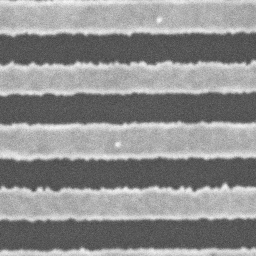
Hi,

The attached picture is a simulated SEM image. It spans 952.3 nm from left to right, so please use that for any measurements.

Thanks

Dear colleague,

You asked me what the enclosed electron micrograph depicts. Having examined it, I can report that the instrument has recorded lines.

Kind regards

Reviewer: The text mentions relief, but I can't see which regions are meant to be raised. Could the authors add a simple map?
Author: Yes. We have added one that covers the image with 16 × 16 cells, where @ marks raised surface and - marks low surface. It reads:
@@@@@@@@@@@@@@@@
@@@@@@@@@@@@@@@@
----------------
----------------
@@@@@@@@@@@@@@@@
@@@@@@@@@@@@@@@@
----------------
----------------
@@@@@@@@@@@@@@@@
@@@@@@@@@@@@@@@@
----------------
----------------
@@@@@@@@@@@@@@@@
@@@@@@@@@@@@@@@@
----------------
----------------